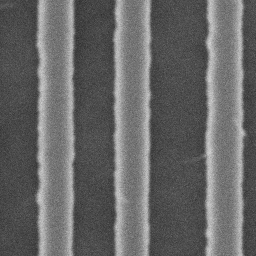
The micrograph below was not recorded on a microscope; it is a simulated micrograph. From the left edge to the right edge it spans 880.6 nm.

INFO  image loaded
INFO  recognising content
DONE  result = lines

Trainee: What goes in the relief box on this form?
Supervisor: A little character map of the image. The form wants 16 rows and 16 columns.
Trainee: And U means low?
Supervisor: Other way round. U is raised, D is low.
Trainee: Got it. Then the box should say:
DDUUUDDUUDDDDUUD
DDUUUDDUUDDDDUUD
DDUUUDDUUDDDDUUD
DDUUUDDUUDDDDUUD
DDUUUDDUUDDDDUUD
DDUUUDDUUDDDDUUD
DDUUUDDUUDDDDUUD
DDUUUDDUUDDDDUUD
DDUUUDDUUDDDDUUD
DDUUUDDUUDDDDUUD
DDUUUDDUUDDDDUUD
DDUUUDDUUDDDDUUD
DDUUUDDUUDDDDUUD
DDUUUDDUUDDDDUUD
DDUUUDDUUDDDDUUD
DDUUUDDUUDDDDUUD